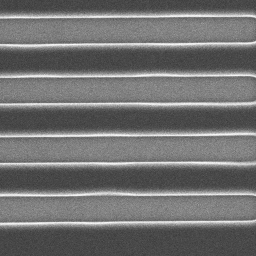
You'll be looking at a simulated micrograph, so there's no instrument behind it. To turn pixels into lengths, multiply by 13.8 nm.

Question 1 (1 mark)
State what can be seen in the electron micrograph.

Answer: groups of lines, slits or small figures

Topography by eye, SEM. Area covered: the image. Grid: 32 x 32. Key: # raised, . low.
################################
################################
................................
................................
................................
........................########
################################
################################
################################
#################..............#
................................
................................
................................
################################
################################
################################
################################
................................
................................
................................
################################
################################
################################
################################
................................
................................
................................
................................
################################
################################
################################
################################